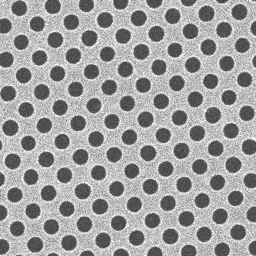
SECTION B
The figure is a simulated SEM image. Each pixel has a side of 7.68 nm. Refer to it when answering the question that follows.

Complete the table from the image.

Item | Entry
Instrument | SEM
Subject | a regular array of holes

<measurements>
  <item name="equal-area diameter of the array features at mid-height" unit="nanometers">121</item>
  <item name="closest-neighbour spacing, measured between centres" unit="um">0.182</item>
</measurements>